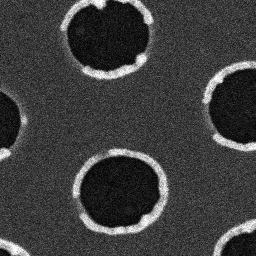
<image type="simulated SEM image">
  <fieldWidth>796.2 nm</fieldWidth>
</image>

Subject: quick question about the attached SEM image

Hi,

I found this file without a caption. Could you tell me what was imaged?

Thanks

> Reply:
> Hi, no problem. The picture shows holes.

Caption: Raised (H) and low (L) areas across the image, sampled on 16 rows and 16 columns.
HHHHHLLLHHHHHHHH
HHHHLLLLLHHHHHHH
HHHHLLLLLHHHHHHH
HHHHHLLLLHHHHHHH
HHHHHHHHHHHHHHHL
HHHHHHHHHHHHHLLL
LHHHHHHHHHHHHLLL
LHHHHHHHHHHHHLLL
LHHHHHHHHHHHHHLL
HHHHHHHHHHHHHHHH
HHHHHHLLLHHHHHHH
HHHHHLLLLLHHHHHH
HHHHHLLLLLHHHHHH
HHHHHHLLLHHHHHHH
HHHHHHHHHHHHHHHH
HHHHHHHHHHHHHHLL